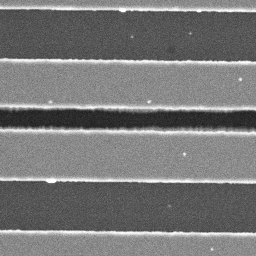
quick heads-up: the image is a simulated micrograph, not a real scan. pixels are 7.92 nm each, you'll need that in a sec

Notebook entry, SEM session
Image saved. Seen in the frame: lines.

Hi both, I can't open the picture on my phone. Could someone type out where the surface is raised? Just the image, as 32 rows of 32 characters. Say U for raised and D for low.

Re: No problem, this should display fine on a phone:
UUUUUUUUUUUUUUUUUUUUUUUUUUUUUUUU
DDDDDDDDDDDDDDDDDDDDDDDDDDDDDDDD
DDDDDDDDDDDDDDDDDDDDDDDDDDDDDDDD
DDDDDDDDDDDDDDDDDDDDDDDDDDDDDDDD
DDDDDDDDDDDDDDDDDDDDDDDDDDDDDDDD
DDDDDDDDDDDDDDDDDDDDDDDDDDDDDDDD
DDDDDDDDDDDDDDDDDDDDDDDDDDDDDDDD
UUUUUUUUUUUUDDDDDDDDDDDDDDDDDDDD
UUUUUUUUUUUUUUUUUUUUUUUUUUUUUUUU
UUUUUUUUUUUUUUUUUUUUUUUUUUUUUUUU
UUUUUUUUUUUUUUUUUUUUUUUUUUUUUUUU
UUUUUUUUUUUUUUUUUUUUUUUUUUUUUUUU
UUUUUUUUUUUUUUUUUUUUUUUUUUUUUUUU
DDDDDUUUDUUUDUUUUUUUUUUUUUUUUUUU
DDDDDDDDDDDDDDDDDDDDDDDDDDDDDDDD
DDDDDDDDDDDDDDDDDDDDDDDDDDDDDDDD
UUUUUUUUUUUUUUUUUUUUUUUUUUUUUUUU
UUUUUUUUUUUUUUUUUUUUUUUUUUUUUUUU
UUUUUUUUUUUUUUUUUUUUUUUUUUUUUUUU
UUUUUUUUUUUUUUUUUUUUUUUUUUUUUUUU
UUUUUUUUUUUUUUUUUUUUUUUUUUUUUUUU
UUUUUUUUUUUUUUUUUUUUUUUUUUUUUUUU
UUUUUUUUUUUUUUUUUUUUUUUUUUUUUUUU
DDDDDDDDDDDDDDDDDDDDDDDDDDDDDDDD
DDDDDDDDDDDDDDDDDDDDDDDDDDDDDDDD
DDDDDDDDDDDDDDDDDDDDDDDDDDDDDDDD
DDDDDDDDDDDDDDDDDDDDDDDDDDDDDDDD
DDDDDDDDDDDDDDDDDDDDDDDDDDDDDDDD
DDDDDDDDDDDDDDDDDDDDDDDDDDDDDDDD
UUUUUUUUUUUUUUUUUUUUUUUUUUUUUUUU
UUUUUUUUUUUUUUUUUUUUUUUUUUUUUUUU
UUUUUUUUUUUUUUUUUUUUUUUUUUUUUUUU